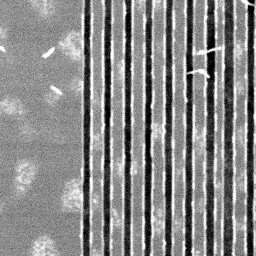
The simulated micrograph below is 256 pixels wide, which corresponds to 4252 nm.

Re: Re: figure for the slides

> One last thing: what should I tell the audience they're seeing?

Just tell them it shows parallel lines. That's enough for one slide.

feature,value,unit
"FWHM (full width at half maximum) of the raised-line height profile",208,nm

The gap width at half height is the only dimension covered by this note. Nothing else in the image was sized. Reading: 129 nanometers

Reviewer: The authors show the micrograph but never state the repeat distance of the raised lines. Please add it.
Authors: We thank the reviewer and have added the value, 20.5 pixels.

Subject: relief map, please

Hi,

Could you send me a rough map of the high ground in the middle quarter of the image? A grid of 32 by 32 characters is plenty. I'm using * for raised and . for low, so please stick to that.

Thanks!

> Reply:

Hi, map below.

*****..***..***..***..***..***..
*****..***..***..***..***..***..
*****..***..***..***..***..***..
*****..***..***..***..***..***..
*****..***..***..***..***..***..
*****..***..***..***..***..***..
*****..***..***..***..***..***..
*****..***..***..***..***..***..
*****..***..***..***..***..****.
*****..***..***..***..***..****.
*****..***..***..***..***..***..
*****..***..***..***..***..***..
*****..***..***..***..***..***..
*****..***..***..***..***..***..
*****..***..***..***..***..***..
*****..***..***..***..***..***..
*****..***..***..***..***..***..
*****..***..***..***..***..***..
*****..***..***..***..***..***..
*****..***..***..***..***..***..
*****..***..***..***..***..***..
*****..***..***..***..***..***..
*****..***..***..***..***..***..
*****..***..***..***..***..***..
*****..***..***..***..***..***..
*****..***..***..***..***..***..
*****..***..***..***..***..***..
*****..***..***..***..***..***..
*****..***..***..***..***..***..
*****..***..***..***..***..***..
****...***..***..***..***..***..
****...***..***..***..***..***..